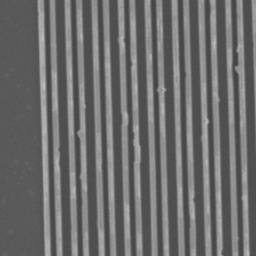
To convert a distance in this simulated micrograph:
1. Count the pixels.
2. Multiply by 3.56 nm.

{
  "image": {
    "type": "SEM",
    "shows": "parallel lines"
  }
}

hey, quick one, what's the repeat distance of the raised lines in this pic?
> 47.1 nanometres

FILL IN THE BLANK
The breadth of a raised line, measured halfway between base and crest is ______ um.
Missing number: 0.0191